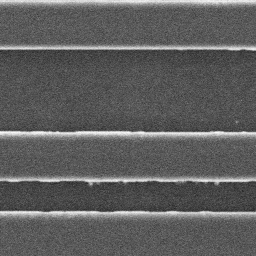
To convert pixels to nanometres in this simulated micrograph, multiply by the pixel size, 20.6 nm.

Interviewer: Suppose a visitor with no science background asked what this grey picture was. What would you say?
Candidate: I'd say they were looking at lines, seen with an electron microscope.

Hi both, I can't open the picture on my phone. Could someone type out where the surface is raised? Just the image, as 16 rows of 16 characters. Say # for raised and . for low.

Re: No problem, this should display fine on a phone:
################
################
################
................
................
................
................
................
################
################
################
................
................
################
################
################